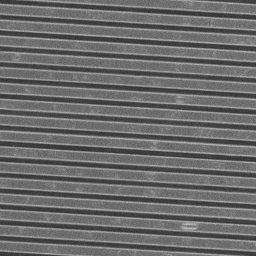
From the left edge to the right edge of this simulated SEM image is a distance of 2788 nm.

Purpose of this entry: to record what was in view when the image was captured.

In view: parallel lines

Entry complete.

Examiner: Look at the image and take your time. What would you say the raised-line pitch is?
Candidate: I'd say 172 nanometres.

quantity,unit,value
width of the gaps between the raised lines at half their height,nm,55.7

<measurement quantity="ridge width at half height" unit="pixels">10.3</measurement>